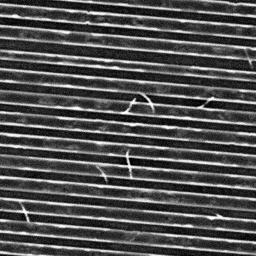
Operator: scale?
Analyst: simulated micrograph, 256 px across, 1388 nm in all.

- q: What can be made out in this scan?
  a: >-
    parallel lines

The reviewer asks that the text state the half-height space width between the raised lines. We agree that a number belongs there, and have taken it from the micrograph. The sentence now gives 44.6 nm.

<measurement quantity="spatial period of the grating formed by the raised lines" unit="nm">117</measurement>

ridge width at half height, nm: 72.9